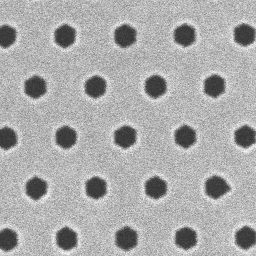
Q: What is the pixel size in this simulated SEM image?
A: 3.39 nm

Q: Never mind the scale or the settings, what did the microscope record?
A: a regular array of holes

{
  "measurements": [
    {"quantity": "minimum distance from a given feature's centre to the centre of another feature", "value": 199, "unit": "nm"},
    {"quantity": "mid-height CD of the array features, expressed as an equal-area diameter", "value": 78.4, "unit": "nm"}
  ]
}